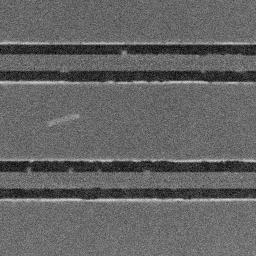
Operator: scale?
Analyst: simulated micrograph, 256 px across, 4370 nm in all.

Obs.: lines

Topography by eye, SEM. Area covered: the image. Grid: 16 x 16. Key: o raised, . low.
oooooooooooooooo
oooooooooooooooo
oooooooooooooooo
................
................
oooooooooooooooo
oooooooooooooooo
oooooooooooooooo
oooooooooooooooo
oooooooooooooooo
................
................
oooooooooooooooo
oooooooooooooooo
oooooooooooooooo
oooooooooooooooo